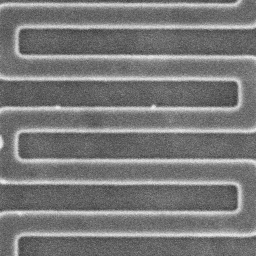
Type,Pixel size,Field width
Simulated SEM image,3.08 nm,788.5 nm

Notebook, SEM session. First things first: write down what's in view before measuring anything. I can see groups of lines, slits or small figures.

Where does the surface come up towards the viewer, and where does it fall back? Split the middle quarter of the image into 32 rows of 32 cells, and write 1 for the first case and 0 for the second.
11111111111111111111111111111111
11111111111111111111111111111111
11111111111111111111111111111111
11111111111111111111111111111111
00000000000000000000000000000000
00000000000000000000000000000000
00000000000000000000000000000000
00000000000000000000000000000000
00000000000000000000000000000000
00000000000000000000000000000000
00000000000000000000000000000000
11111111111111111111111111111111
11111111111111111111111111111111
11111111111111111111111111111111
11111111111111111111111111111111
11111111111111111111111111111111
11111111111111111111111111111111
00000000000000000000000000000000
00000000000000000000000000000000
00000000000000000000000000000000
00000000000000000000000000000000
00000000000000000000000000000000
00000000000000000000000000000000
00000000000000000000000000000000
11111111111111111111111111111111
11111111111111111111111111111111
11111111111111111111111111111111
11111111111111111111111111111111
11111111111111111111111111111111
11111111111111111111111111111111
00000000000000000000000000000000
00000000000000000000000000000000